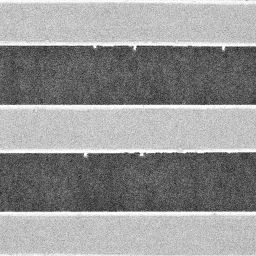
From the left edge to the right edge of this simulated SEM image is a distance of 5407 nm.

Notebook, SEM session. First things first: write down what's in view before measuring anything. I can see lines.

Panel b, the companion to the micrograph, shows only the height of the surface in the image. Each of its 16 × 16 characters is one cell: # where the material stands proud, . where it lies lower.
################
################
################
................
................
................
................
################
################
...........#....
................
................
................
################
################
################